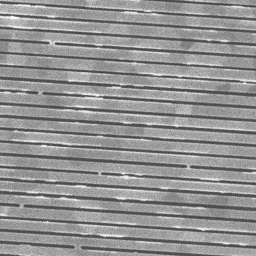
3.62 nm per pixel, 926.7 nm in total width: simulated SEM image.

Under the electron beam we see parallel lines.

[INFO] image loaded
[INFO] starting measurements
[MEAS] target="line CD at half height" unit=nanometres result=34.3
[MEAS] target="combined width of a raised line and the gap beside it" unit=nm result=45.7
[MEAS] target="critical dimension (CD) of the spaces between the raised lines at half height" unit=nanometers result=12.2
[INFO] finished